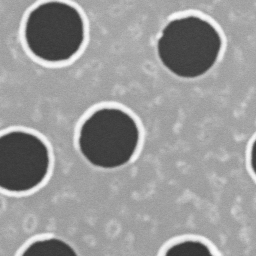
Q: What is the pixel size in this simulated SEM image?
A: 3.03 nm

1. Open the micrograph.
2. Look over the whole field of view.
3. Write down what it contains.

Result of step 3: holes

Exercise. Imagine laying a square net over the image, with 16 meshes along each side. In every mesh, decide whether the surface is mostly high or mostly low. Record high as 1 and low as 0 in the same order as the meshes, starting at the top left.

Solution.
1100011111111111
1100011111100111
1100011111000011
1100111111000011
1111111111100111
1111111111111111
1111111111111111
1111100011111111
0011100001111111
0001100011111111
0001111111111111
0011111111111111
1111111111111111
1111111111111111
1111111111111111
1100111111100111